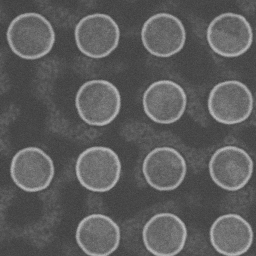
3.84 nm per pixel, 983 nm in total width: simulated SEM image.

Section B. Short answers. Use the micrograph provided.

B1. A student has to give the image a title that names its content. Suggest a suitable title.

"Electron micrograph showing a regular array of raised bodies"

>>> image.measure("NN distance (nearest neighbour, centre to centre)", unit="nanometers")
254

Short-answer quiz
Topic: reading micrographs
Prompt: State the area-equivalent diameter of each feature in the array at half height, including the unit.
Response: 157 nm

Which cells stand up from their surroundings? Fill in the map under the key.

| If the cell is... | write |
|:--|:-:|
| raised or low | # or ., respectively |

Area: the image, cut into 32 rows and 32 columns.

................................
................................
..####....####.....###.....####.
.#####....#####...#####...#####.
.######...#####...#####...#####.
.#####....####....#####...#####.
..####.....###.....###.....###..
................................
................................
................................
...........###.....###......##..
..........#####...#####....####.
..........#####...#####...#####.
..........#####...#####...#####.
..........####.....###.....####.
................................
................................
................................
................................
..####....####.....###.....####.
..####....#####...#####...#####.
..####....#####...#####...#####.
..####....#####....####....####.
...##......###......#.......##..
................................
................................
................................
...........###.....###.....###..
..........#####...#####....####.
..........#####...#####...#####.
..........#####...#####....####.
...........###.....###......##..